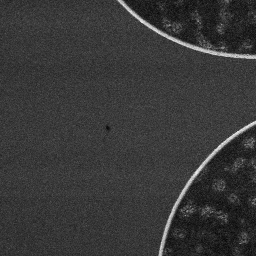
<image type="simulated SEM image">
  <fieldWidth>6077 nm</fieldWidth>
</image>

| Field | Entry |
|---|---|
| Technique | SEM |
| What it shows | one or a few lines or trenches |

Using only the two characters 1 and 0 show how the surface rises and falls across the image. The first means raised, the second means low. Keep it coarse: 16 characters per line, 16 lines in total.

0000000011111111
0000000001111111
0000000000011111
0000000000000001
0000000000000000
0000000000000000
0000000000000000
0000000000000000
0000000000000001
0000000000000111
0000000000000111
0000000000001111
0000000000011111
0000000000011111
0000000000111111
0000000000111111